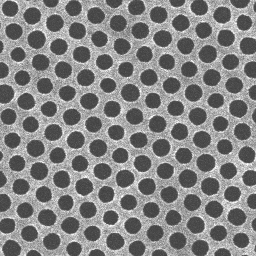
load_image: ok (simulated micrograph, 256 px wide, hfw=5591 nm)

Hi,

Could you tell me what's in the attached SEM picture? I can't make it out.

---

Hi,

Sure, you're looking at a regular array of holes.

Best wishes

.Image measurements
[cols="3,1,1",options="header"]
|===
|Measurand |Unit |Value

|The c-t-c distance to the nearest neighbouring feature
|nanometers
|511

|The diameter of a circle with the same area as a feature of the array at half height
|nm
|376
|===